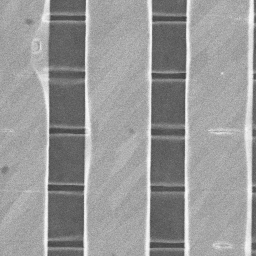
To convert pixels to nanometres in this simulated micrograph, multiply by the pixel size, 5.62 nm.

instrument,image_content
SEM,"wiring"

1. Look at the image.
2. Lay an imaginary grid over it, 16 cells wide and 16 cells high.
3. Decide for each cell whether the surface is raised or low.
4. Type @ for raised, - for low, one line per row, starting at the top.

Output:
@@@--@@@@---@@@@
@@@--@@@@---@@@@
@@@--@@@@---@@@@
@@@--@@@@---@@@@
@@@--@@@@---@@@@
@@@--@@@@---@@@@
@@@--@@@@---@@@@
@@@--@@@@---@@@@
@@@--@@@@---@@@-
@@@--@@@@---@@@@
@@@--@@@@---@@@@
@@@--@@@@---@@@@
@@@--@@@@---@@@@
@@@--@@@@---@@@@
@@@--@@@@---@@@@
@@@--@@@@---@@@-